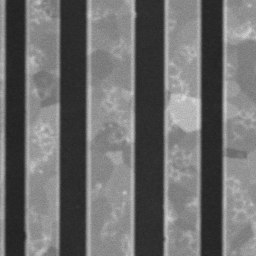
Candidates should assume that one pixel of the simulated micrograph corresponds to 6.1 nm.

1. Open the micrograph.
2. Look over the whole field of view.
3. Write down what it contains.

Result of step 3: one or a few lines or trenches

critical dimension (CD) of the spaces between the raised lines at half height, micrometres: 0.166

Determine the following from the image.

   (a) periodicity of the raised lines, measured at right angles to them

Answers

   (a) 426 nm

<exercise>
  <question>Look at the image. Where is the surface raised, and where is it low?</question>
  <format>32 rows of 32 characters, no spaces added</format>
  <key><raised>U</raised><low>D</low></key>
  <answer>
DDDUUUUDDDDUUUUUUDDDDUUUUDDDUUUU
DDDDUUUDDDDUUUUUUDDDDUUUUDDDUUUU
DDDDUUUDDDDUUUUUUDDDDUUUUDDDUUUU
DDDDUUUDDDDUUUUUUDDDDUUUUDDDUUUU
DDDDUUUDDDDUUUUUUDDDDUUUUDDDUUUU
DDDDUUUDDDDUUUUUUDDDDUUUUDDDUUUU
DDDUUUUDDDDUUUUUUDDDDUUUUDDDUUUU
DDDUUUUDDDDUUUUUUDDDDUUUUDDDUUUU
DDDUUUUDDDDUUUUUUDDDDUUUUDDDUUUU
DDDUUUUDDDDUUUUUUDDDDUUUUDDDUUUU
DDDUUUUDDDDUUUUUUDDDDUUUUDDDUUUU
DDDUUUUDDDDUUUUUUDDDDUUUUDDDUUUU
DDDUUUUDDDDUUUUUUDDDDUUUUDDDUUUU
DDDUUUUDDDDUUUUUUDDDDUUUUDDDUUUU
DDDDUUUDDDDUUUUUUDDDDUUUUDDDUUUU
DDDDUUUDDDDUUUUUUDDDDUUUUDDDUUUU
DDDUUUUDDDDUUUUUUDDDDUUUUDDDUUUU
DDDUUUUDDDDUUUUUUDDDDUUUUDDDUUUU
DDDUUUUDDDDUUUUUUDDDDUUUUDDDUUUU
DDDUUUUDDDDUUUUUUDDDDUUUUDDDUUUU
DDDUUUUDDDDUUUUUUDDDDUUUUDDDUUUU
DDDUUUUDDDDUUUUUUDDDDUUUUDDDUUUU
DDDUUUUDDDDUUUUUUDDDDUUUUDDDUUUU
DDDUUUUDDDDUUUUUUDDDDUUUUDDDUUUU
DDDUUUUDDDDUUUUUUDDDDUUUUDDDUUUU
DDDUUUUDDDDUUUUUUDDDDUUUUDDDUUUU
DDDUUUUDDDDUUUUUUDDDDUUUUDDDUUUU
DDDUUUUDDDDUUUUUUDDDDUUUUDDDUUUU
DDDUUUUDDDDUUUUUUDDDDUUUUDDDUUUU
DDDUUUUDDDDUUUUUUDDDDUUUUDDDUUUU
DDDUUUUDDDDUUUUUUDDDDUUUUDDDUUUU
DDDUUUUDDDDUUUUUUDDDDUUUUDDDUUUU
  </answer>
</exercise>